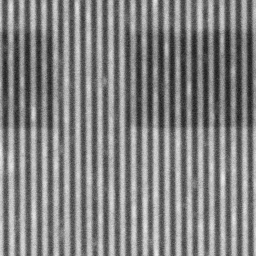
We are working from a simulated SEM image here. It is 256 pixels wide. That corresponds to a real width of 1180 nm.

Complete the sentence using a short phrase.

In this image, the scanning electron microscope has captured parallel lines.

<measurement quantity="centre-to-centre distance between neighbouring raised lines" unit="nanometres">51.3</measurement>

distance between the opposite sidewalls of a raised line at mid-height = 21.9 nm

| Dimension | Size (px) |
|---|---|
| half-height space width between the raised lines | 6.64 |